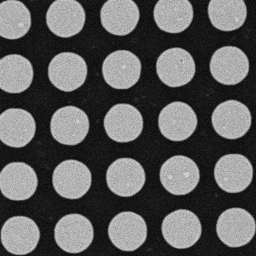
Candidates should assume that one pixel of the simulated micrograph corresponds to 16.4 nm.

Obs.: an array of small figures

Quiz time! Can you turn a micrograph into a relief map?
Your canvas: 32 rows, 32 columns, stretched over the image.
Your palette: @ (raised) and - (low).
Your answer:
@@@---@@@@---@@@@---@@@@--@@@@@-
@@@@--@@@@@--@@@@--@@@@@--@@@@@-
@@@@--@@@@@--@@@@--@@@@@--@@@@@-
@@@@--@@@@---@@@@---@@@----@@@--
@@@----@@-----------------------
--------------------------------
--------------@@----@@@----@@@--
@@@----@@@---@@@@---@@@@--@@@@@-
@@@@--@@@@@--@@@@@--@@@@--@@@@@-
@@@@--@@@@@--@@@@---@@@@---@@@@-
@@@@---@@@---@@@@----@@-----@@--
-@@-----------------------------
--------------------------------
--------@@----@@@----@@@---@@@@-
@@@@---@@@@--@@@@@--@@@@---@@@@-
@@@@--@@@@@--@@@@@--@@@@@--@@@@-
@@@@--@@@@@--@@@@@--@@@@---@@@@-
@@@@---@@@----@@@----@@---------
--------------------------------
----------------------@-----@@--
-@@-----@@----@@@---@@@@---@@@@-
@@@@---@@@@--@@@@@--@@@@@--@@@@@
@@@@@--@@@@--@@@@@--@@@@@--@@@@-
@@@@@--@@@@---@@@@---@@@----@@@-
-@@@----@@-----@----------------
--------------------------------
----------------@-----@@----@@@-
-@@@----@@@---@@@@--@@@@@--@@@@@
@@@@@--@@@@@--@@@@--@@@@@--@@@@@
@@@@@--@@@@@--@@@@--@@@@@--@@@@@
@@@@@--@@@@---@@@@---@@@----@@@-
-@@@----@@----------------------